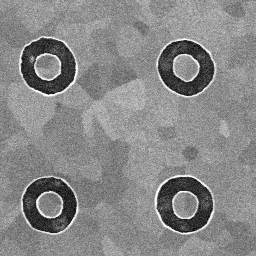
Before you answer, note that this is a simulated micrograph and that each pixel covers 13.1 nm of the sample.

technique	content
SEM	ring-shaped grooves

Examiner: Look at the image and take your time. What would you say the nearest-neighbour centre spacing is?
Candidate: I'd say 136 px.